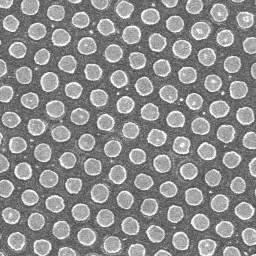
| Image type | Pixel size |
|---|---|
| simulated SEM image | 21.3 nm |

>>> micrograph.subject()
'a regular array of raised bodies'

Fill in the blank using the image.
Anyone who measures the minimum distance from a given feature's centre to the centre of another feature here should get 546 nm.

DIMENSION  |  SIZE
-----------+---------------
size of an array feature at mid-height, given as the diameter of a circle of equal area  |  358 nm